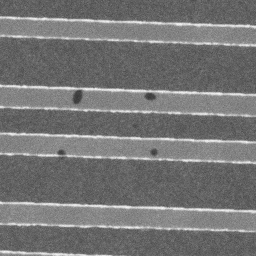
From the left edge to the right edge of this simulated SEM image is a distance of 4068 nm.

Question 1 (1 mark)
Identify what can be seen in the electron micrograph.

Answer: lines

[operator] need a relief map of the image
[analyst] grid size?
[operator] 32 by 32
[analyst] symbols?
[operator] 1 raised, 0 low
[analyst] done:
00000000000000000000000000000000
00000000000000000000000000000000
11111111000000000000000000000000
11111111111111111111111111111111
01111111111111111111111111111111
00000000000000000000000000001111
00000000000000000000000000000000
00000000000000000000000000000000
00000000000000000000000000000000
00000000000000000000000000000000
00000000000000000000000000000000
11111111111111111111100000000000
11111111111111111111111111111111
01111111111111111111111111111111
00000000000000000000000000000000
00000000000000000000000000000000
00000000000000000000000000000000
11111111111111111111111110000000
11111111111111111111111111111111
00000000111111111111111111111111
00000000000000000000000000000000
00000000000000000000000000000000
00000000000000000000000000000000
00000000000000000000000000000000
00000000000000000000000000000000
11111000000000000000000000000000
11111111111111111111111111111111
11111111111111111111111111111111
00000000000000000001111111111111
00000000000000000000000000000000
00000000000000000000000000000000
11000000000000000000000000000000